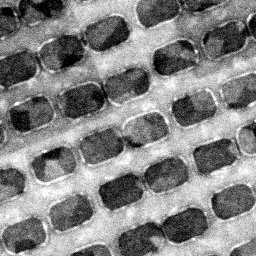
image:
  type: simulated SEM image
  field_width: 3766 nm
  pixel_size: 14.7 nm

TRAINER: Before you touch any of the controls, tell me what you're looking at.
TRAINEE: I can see a regular array of raised bodies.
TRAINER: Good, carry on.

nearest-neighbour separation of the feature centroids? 743 nanometres